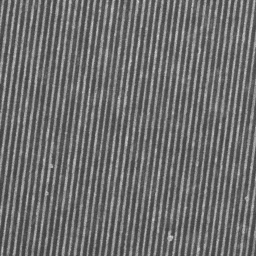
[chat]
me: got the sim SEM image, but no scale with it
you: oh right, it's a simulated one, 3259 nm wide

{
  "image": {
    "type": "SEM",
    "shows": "parallel lines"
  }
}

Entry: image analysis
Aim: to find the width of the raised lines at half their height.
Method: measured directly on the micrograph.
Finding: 18.9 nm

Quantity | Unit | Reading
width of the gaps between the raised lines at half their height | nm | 55.2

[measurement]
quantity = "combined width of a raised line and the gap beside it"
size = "6.07 px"